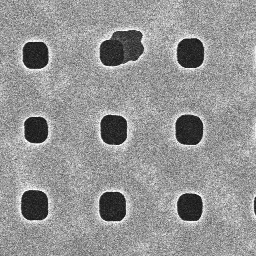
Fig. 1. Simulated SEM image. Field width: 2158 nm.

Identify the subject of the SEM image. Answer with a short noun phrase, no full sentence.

a regular array of holes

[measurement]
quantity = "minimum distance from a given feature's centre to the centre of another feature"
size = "635 nm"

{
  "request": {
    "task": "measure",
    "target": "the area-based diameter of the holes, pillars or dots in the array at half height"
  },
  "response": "254 nm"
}